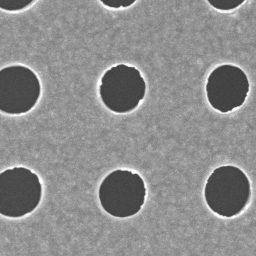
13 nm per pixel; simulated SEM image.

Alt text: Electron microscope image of holes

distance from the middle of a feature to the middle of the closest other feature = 1350 nm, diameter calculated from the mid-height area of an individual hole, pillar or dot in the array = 610 nanometres